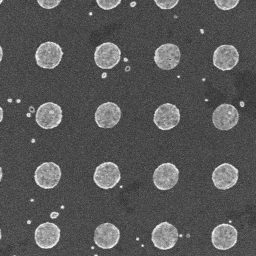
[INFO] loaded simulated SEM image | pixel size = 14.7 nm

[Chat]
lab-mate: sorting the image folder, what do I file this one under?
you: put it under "a regular array of raised bodies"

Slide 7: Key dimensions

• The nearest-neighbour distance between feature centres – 860 nanometres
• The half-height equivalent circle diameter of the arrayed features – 378 nm